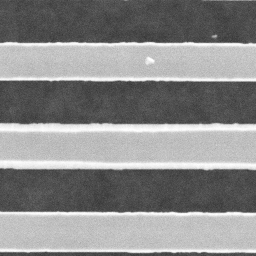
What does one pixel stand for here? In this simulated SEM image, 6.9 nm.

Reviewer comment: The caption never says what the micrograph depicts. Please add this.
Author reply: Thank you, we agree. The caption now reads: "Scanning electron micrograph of lines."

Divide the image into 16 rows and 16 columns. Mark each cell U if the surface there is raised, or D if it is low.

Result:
DDDDDDDDDDDDDDDD
DDDDDDDDDDDDDDDD
DDDDDDDDDDDDDDDD
UUUUUUUUUUUUUUUU
UUUUUUUUUUUUUUUU
DDDDDDDDDDDDDDDD
DDDDDDDDDDDDDDDD
DDDDDDDDDDDDDDDD
UUUUUUUUUUUUUUUU
UUUUUUUUUUUUUUUU
DDDDDDDDDDDDDDDD
DDDDDDDDDDDDDDDD
DDDDDDDDDDDDDDDD
UUUUUUUUUUUUUUUU
UUUUUUUUUUUUUUUU
UUUUUUUUUUUUUUUU